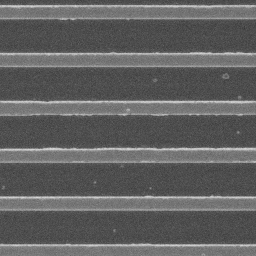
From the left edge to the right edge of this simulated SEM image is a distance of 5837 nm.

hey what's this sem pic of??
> lines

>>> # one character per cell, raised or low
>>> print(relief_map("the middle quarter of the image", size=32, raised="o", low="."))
oooooooooooooooooooooooooooooooo
................................
................................
................................
................................
................................
................................
................................
................................
oooooo..oooooooooooo.oooooo..ooo
oooooooooooooooooooooooooooooooo
oooooooooooooooooooooooooooooooo
oooooooooooooooooooooooooooooooo
................................
................................
................................
................................
................................
................................
................................
................................
oooooooooooooooooooooooooooooooo
oooooooooooooooooooooooooooooooo
oooooooooooooooooooooooooooooooo
................................
................................
................................
................................
................................
................................
................................
................................